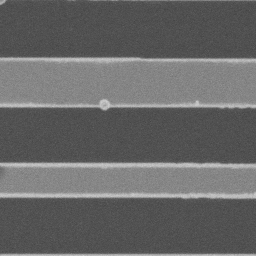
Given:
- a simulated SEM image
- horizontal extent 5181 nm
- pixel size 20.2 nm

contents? lines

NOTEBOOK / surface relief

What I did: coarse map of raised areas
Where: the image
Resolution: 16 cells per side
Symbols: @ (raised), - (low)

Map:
----------------
----------------
----------------
----------------
@@@@@@@@@@@@@@@@
@@@@@@@@@@@@@@@@
@@@@@@@@@@@@@@@@
----------------
----------------
----------------
@@@@@@@@@@@@@@@@
@@@@@@@@@@@@@@@@
----------------
----------------
----------------
----------------